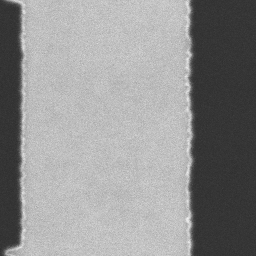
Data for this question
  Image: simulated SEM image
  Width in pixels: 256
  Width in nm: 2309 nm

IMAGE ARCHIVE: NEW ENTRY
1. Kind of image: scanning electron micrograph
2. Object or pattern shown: one or a few lines or trenches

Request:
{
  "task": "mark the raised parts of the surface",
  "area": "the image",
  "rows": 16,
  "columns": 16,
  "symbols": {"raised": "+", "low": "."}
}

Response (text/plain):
+...........++++
+...........++++
+...........++++
++..........++++
++..........++++
++..........++++
+...........++++
+...........++++
+...........++++
+...........++++
+...........++++
+...........++++
+...........++++
+...........++++
+...........++++
+...........++++